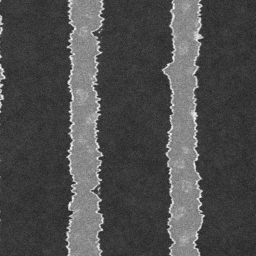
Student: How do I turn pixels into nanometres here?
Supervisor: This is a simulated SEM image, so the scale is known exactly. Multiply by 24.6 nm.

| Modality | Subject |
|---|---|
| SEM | one or a few lines or trenches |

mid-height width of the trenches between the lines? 1.79 microns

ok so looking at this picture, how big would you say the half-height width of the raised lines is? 655 nanometers